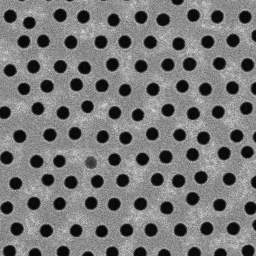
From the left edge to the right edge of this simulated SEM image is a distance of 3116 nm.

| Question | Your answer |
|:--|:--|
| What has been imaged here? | a regular array of holes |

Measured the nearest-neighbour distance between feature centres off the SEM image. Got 286 nanometers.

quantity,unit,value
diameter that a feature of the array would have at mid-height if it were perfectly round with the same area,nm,160